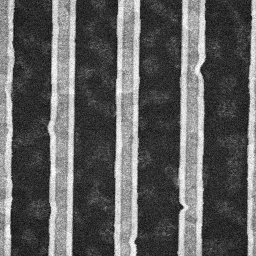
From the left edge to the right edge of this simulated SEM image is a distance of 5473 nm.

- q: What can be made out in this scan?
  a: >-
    one or a few lines or trenches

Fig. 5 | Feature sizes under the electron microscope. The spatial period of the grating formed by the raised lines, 1390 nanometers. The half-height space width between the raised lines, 1030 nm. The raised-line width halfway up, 361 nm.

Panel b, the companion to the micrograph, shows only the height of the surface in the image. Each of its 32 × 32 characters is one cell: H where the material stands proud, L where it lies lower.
HLLLLLLHHLLLLLLHHLLLLLLHHLLLLLLL
HLLLLLLHHLLLLLLHHLLLLLLHHLLLLLLL
HLLLLLLHHLLLLLLHHLLLLLLHHLLLLLLL
HLLLLLLHHLLLLLLHHLLLLLLHHLLLLLLL
HLLLLLLHHLLLLLLHHLLLLLLHHLLLLLLL
HLLLLLLHHLLLLLLHHLLLLLLHHLLLLLLL
HLLLLLLHHLLLLLLHHLLLLLLHHLLLLLLL
HLLLLLLHHLLLLLLHHLLLLLLHHLLLLLLL
HLLLLLLHHLLLLLLHHLLLLLLHHLLLLLLL
HLLLLLLHHLLLLLLHHLLLLLLHHLLLLLLL
HLLLLLLHHLLLLLLHHLLLLLLHHLLLLLLL
HLLLLLLHHLLLLLLHHLLLLLLHHLLLLLLL
HLLLLLLHHLLLLLLHHLLLLLLHHLLLLLLL
HLLLLLLHHLLLLLLHHLLLLLLHHLLLLLLL
HLLLLLLHHLLLLLLHHLLLLLLHHLLLLLLL
HLLLLLHHHLLLLLLHHLLLLLLHHLLLLLLH
HLLLLLHHHLLLLLLHHLLLLLLHHLLLLLLH
HLLLLLLHHLLLLLLHHLLLLLLHHLLLLLLH
HLLLLLLHHLLLLLLHHLLLLLLHHLLLLLLL
HLLLLLLHHLLLLLLHHLLLLLLHHLLLLLLH
HLLLLLLHHLLLLLLHHLLLLLLHHLLLLLLH
HLLLLLLHHLLLLLLHHLLLLLLHHLLLLLLH
HLLLLLLHHLLLLLLHHLLLLLLHHLLLLLLH
HLLLLLLHHLLLLLLHHLLLLLLHHLLLLLLH
HLLLLLLHHLLLLLLHHLLLLLLHHLLLLLLH
HLLLLLLHHLLLLLLHHLLLLLLHHLLLLLLH
HLLLLLLHHLLLLLLHHLLLLLLHHLLLLLLH
HLLLLLLHHLLLLLLHHLLLLLLHHLLLLLLH
HLLLLLHHHLLLLLLHHLLLLLLHHLLLLLLH
HLLLLLLHHLLLLLLHHLLLLLLHHLLLLLLH
HLLLLLLHHLLLLLLHHLLLLLLHHLLLLLLH
HLLLLLLHHLLLLLLHHLLLLLLHHLLLLLLH